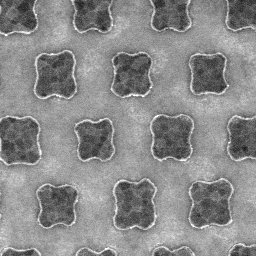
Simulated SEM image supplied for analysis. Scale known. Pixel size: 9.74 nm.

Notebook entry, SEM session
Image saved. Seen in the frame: a regular array of raised bodies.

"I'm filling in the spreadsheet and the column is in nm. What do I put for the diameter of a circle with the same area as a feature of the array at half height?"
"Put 442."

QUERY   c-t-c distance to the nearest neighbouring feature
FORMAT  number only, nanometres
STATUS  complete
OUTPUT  733